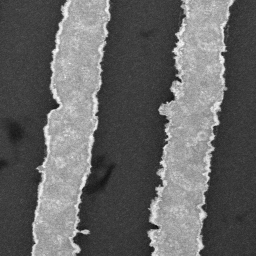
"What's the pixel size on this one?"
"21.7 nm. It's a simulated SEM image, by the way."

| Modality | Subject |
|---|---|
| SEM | one or a few lines or trenches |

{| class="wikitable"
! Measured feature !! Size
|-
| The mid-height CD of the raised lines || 962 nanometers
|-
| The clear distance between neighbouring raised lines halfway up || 1650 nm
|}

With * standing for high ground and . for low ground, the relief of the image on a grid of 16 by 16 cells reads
....***.....**..
....***....***..
....***....***..
...***.....***..
...***.....***..
...***.....***..
....**....****..
...***....***...
...***.....**...
...***....***...
...***....***...
...**.....***...
..***.....***...
..***.....***...
..***.....***...
..***.....**....